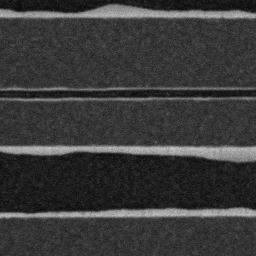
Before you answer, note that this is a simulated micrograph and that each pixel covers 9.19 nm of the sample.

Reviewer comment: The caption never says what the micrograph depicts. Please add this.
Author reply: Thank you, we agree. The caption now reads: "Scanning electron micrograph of lines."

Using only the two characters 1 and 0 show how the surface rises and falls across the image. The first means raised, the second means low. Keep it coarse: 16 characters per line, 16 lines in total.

0000000000000000
1111111111111111
1111111111111111
1111111111111111
1111111111111111
1111111111111111
1111111111111111
1111111111111111
1111111111111111
0000000000001111
0000000000000000
0000000000000000
0000000000000000
1111111111111111
1111111111111111
1111111111111111